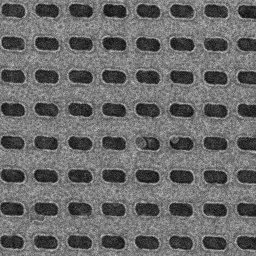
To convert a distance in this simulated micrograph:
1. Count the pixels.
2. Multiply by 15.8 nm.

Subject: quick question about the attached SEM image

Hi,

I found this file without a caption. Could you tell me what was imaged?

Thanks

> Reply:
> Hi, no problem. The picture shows a regular array of holes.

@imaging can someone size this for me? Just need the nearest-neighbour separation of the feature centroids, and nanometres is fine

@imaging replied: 519